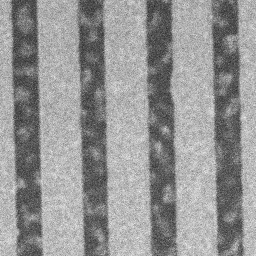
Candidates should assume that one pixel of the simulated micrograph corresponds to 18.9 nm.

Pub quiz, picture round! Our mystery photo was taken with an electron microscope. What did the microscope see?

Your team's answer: one or a few lines or trenches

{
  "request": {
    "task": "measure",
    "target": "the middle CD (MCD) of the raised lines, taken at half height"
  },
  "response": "738 nanometers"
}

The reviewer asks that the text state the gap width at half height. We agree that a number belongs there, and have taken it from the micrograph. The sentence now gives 516 nm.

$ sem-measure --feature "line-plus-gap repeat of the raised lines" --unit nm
1260